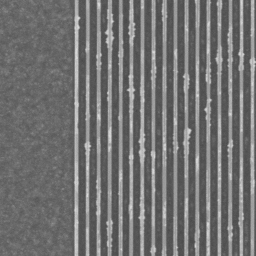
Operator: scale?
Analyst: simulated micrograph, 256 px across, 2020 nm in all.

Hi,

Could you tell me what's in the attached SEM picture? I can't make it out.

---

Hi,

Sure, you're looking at parallel lines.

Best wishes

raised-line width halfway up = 0.0266 µm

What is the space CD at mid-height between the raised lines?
60.1 nm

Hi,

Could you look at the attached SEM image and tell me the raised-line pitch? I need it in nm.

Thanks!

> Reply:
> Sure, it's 86.6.